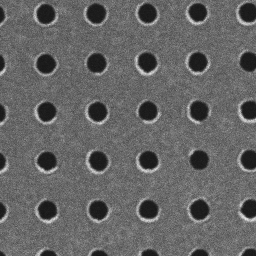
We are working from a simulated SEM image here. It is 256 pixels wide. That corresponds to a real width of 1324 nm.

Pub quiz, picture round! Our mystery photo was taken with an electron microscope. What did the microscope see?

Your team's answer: a regular array of holes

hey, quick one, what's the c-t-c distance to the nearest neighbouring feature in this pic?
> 253 nm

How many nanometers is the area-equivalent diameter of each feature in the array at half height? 99